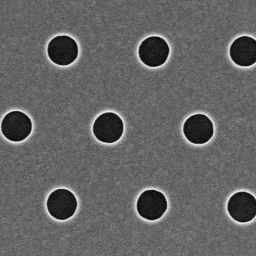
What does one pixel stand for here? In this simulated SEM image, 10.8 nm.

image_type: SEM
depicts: holes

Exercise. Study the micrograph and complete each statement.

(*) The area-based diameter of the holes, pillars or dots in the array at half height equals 0.331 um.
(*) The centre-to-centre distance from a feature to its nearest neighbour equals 958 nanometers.